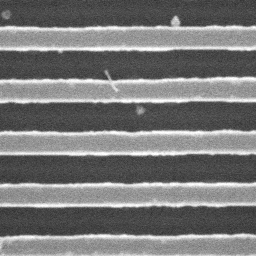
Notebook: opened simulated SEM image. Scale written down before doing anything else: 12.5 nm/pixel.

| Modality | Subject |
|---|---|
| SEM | lines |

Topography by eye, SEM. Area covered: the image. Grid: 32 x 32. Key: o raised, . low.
................................
................................
................................
ooooo.....oooooooooooooooooooooo
oooooooooooooooooooooooooooooooo
oooooooooooooooooooooooooooooooo
................................
................................
................................
................................
oooooooooooooooooooooooooooooooo
oooooooooooooooooooooooooooooooo
oooooooooooooooooooooooooooooooo
................................
................................
................................
...........................ooo..
oooooooooooooooooooooooooooooooo
oooooooooooooooooooooooooooooooo
................................
................................
................................
................................
oooooooooooooooooooooooooooooooo
oooooooooooooooooooooooooooooooo
oooooooooooooooooooooooooooooooo
................................
................................
................................
.........oooooooo......ooooooooo
oooooooooooooooooooooooooooooooo
oooooooooooooooooooooooooooooooo